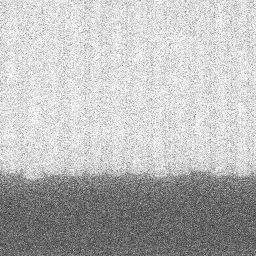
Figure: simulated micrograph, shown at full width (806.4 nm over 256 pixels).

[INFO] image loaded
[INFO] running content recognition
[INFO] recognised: parallel lines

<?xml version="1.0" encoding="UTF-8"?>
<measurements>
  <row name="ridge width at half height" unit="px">5.37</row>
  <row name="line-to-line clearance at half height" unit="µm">0.0504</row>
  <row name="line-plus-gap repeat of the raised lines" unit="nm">66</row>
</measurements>